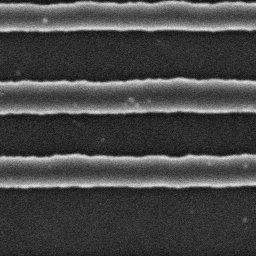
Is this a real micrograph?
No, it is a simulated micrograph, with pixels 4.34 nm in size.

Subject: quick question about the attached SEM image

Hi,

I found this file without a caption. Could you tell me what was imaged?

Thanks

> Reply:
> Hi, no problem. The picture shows lines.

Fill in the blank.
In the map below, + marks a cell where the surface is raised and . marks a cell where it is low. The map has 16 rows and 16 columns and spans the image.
++++++++++++++++
++++++++++++++++
................
................
................
++++++++++++++++
++++++++++++++++
................
................
................
++++++++++++++++
++++++++++++++++
................
................
................
................